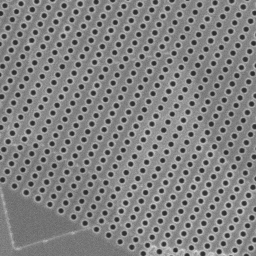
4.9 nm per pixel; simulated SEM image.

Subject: a regular array of holes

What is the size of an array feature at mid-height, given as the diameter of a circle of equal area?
26.5 nanometers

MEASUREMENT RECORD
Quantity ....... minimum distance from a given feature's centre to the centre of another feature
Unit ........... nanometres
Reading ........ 44